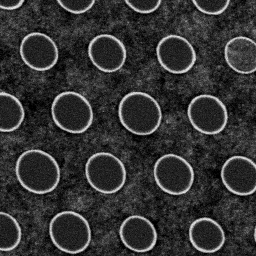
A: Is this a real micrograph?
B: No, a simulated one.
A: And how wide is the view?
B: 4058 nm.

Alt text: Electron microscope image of a regular array of raised bodies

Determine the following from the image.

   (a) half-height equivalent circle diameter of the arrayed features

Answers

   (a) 0.6 microns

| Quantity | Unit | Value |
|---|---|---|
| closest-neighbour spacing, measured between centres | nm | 1080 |